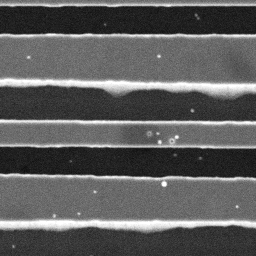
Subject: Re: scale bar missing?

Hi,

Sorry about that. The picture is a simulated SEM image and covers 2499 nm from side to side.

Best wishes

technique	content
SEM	lines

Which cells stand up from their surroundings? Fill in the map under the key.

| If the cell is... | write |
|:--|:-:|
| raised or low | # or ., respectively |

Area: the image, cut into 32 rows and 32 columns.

################################
................................
................................
................................
################################
################################
################################
################################
################################
################################
..............##################
................................
................................
................................
................................
################################
################################
################################
................................
................................
................................
................................
################################
################################
################################
################################
################################
################################
................................
................................
................................
................................